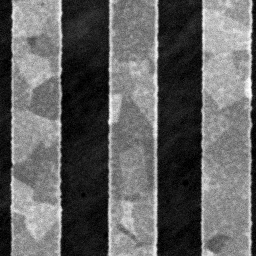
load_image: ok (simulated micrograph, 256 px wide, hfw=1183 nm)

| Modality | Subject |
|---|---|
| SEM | lines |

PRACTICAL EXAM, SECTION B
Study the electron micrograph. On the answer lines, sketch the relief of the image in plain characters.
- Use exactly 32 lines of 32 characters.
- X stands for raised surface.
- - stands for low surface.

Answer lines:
--XXXXXX------XXXXXX-----XXXXXX-
--XXXXXX------XXXXXX-----XXXXXX-
--XXXXXX------XXXXXX-----XXXXXX-
--XXXXXX------XXXXXX-----XXXXXX-
--XXXXXX------XXXXXX-----XXXXXX-
--XXXXXX------XXXXXX-----XXXXXX-
--XXXXXX------XXXXXX-----XXXXXX-
--XXXXXX------XXXXXX-----XXXXXX-
--XXXXXX------XXXXXX-----XXXXXX-
--XXXXXX------XXXXXX-----XXXXXX-
--XXXXXX------XXXXXX-----XXXXXX-
--XXXXXX------XXXXXX-----XXXXXX-
--XXXXXX------XXXXXX-----XXXXXX-
--XXXXXX------XXXXXX-----XXXXXX-
--XXXXXX------XXXXXX-----XXXXXX-
--XXXXXX------XXXXXX-----XXXXXX-
--XXXXXX------XXXXXX-----XXXXXX-
--XXXXXX------XXXXX------XXXXXX-
--XXXXX-------XXXXXX-----XXXXXX-
--XXXXXX------XXXXXX-----XXXXXX-
--XXXXX-------XXXXXX-----XXXXXX-
-XXXXXX-------XXXXXX-----XXXXXX-
--XXXXXX------XXXXXX-----XXXXXX-
--XXXXX-------XXXXXX-----XXXXXX-
--XXXXXX------XXXXXX-----XXXXXX-
--XXXXXX------XXXXXX-----XXXXXX-
-XXXXXXX------XXXXXX-----XXXXXX-
-XXXXXXX------XXXXX------XXXXXX-
--XXXXXX------XXXXXX-----XXXXXX-
--XXXXXX------XXXXX------XXXXXX-
--XXXXX-------XXXXX------XXXXXX-
-XXXXXX-------XXXXX------XXXXXX-